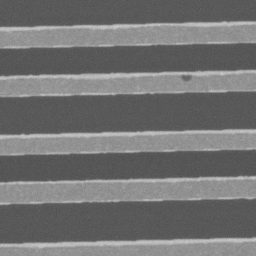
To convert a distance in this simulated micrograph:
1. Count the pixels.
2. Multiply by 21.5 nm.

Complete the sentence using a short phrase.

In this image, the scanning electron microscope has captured lines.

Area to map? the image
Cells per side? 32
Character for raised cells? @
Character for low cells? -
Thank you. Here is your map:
--------------------------------
--------------------------------
--------------------------------
---@@@@@@@@@@@@@@@@@@@@@@@@@@@@@
@@@@@@@@@@@@@@@@@@@@@@@@@@@@@@@@
@@@@@@@@@@@@@@@@@@@@@@@---------
--------------------------------
--------------------------------
--------------------------------
-------@@@@@@@@@@@@@@@@@@@@@@@@@
@@@@@@@@@@@@@@@@@@@@@@@@@@@@@@@@
@@@@@@@@@@@@@@@@@@@@@@@---------
--------------------------------
--------------------------------
--------------------------------
--------------------------------
--------------------@@@@@@@@@@@@
@@@@@@@@@@@@@@@@@@@@@@@@@@@@@@@@
@@@@@@@@@@@@@@@@@@@@@@@@@@@@@@@@
--------------------------------
--------------------------------
--------------------------------
-------------------@@@@@@@@@@@@@
@@@@@@@@@@@@@@@@@@@@@@@@@@@@@@@@
@@@@@@@@@@@@@@@@@@@@@@@@@@@@@@@@
@@------------------------------
--------------------------------
--------------------------------
--------------------------------
--------------------------------
-------@@@@@@@@@@@@@@@@@@@@@@@@@
@@@@@@@@@@@@@@@@@@@@@@@@@@@@@@@@